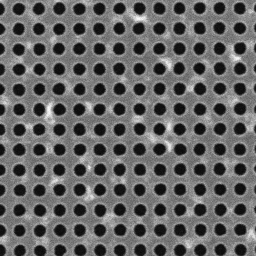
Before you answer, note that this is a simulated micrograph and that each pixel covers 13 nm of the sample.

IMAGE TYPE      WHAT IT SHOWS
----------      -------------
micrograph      a regular array of holes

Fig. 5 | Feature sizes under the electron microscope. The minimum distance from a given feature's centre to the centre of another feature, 258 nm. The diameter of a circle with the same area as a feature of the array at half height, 164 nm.